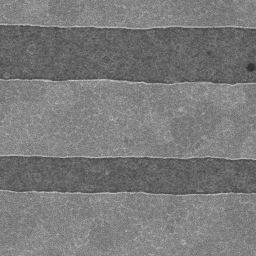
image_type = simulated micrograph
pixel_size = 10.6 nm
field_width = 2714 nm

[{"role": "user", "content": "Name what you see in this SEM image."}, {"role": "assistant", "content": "one or a few lines or trenches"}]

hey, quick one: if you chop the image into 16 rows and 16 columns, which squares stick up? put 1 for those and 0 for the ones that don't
1111111111111111
1111111111111111
0000000000000000
0000000000000000
0000000000000000
1111111111111111
1111111111111111
1111111111111111
1111111111111111
1111111111111111
0000000000000000
0000000000000000
1111111111111111
1111111111111111
1111111111111111
1111111111111111